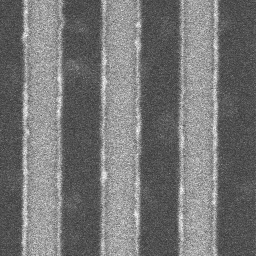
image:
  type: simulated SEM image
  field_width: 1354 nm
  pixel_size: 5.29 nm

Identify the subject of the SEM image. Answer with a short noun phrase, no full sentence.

one or a few lines or trenches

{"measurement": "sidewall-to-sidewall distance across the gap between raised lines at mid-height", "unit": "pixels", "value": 31.5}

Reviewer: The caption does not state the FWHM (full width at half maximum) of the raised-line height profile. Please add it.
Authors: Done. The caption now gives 0.243 micrometres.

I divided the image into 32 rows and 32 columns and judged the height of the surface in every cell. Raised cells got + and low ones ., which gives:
+++....++++++....++++++....+++++
+++....++++++....++++++....+++++
+++.....+++++....++++++....+++++
+++....++++++....++++++....+++++
+++....++++++....++++++....+++++
+++....++++++....++++++....+++++
+++....++++++....++++++....+++++
+++....++++++....++++++....+++++
+++....++++++....++++++....+++++
+++....++++++....++++++....+++++
+++....++++++....++++++....+++++
+++....++++++....++++++....+++++
+++....++++++....++++++....+++++
+++....++++++....++++++....+++++
+++....++++++....++++++....+++++
+++....++++++....++++++....+++++
++++...++++++....++++++....+++++
+++....++++++....++++++....+++++
+++....++++++....++++++....+++++
+++....++++++....++++++....+++++
+++....++++++....++++++....+++++
+++....++++++....++++++....+++++
+++....++++++....++++++....+++++
+++....++++++....++++++....+++++
+++....++++++....++++++....+++++
+++....++++++....++++++....+++++
+++....++++++....++++++....+++++
+++....++++++....++++++....+++++
+++....++++++....++++++....+++++
+++....++++++....++++++....+++++
+++....++++++....++++++....+++++
+++....++++++....++++++....+++++